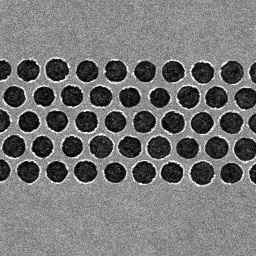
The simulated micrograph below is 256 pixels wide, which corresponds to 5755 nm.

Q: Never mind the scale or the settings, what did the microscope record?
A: a regular array of holes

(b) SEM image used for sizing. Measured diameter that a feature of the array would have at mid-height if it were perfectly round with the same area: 0.505 micrometres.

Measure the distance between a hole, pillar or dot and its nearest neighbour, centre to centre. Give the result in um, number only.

0.633